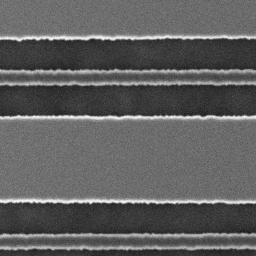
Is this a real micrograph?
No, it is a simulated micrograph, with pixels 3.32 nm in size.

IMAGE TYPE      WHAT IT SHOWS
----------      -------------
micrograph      lines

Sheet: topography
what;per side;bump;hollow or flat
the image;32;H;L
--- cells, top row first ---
HHHHHHHHHHHHHHHHHHHHHHHHHHHHHHHH
HHHHHHHHHHHHHHHHHHHHHHHHHHHHHHHH
HHHHHHHHHHHHHHHHHHHHHHHHHHHHHHHH
HHHHHHHHHHHHHHHHHHHHHHHHHHHHHHHH
HHHHHHHHHHHHHHHHHHHHHHHHHHHHHHHH
LLLLLLLLLLLLLLLLLLLLLLLLLLLLLLLL
LLLLLLLLLLLLLLLLLLLLLLLLLLLLLLLL
LLLLLLLLLLLLLLLLLLLLLLLLLLLLLLLL
LLLLLLLLLLLLLLLLLLLLLLLLLLLLLLLL
HHHHHHHHHHHHHHHHHHHHHHHHHHHHHHHH
HHHHHHHHHHHHHLLHHLLHLLHLHLLHHHLH
LLLLLLLLLLLLLLLLLLLLLLLLLLLLLLLL
LLLLLLLLLLLLLLLLLLLLLLLLLLLLLLLL
LLLLLLLLLLLLLLLLLLLLLLLLLLLLLLLL
LLLLLLLLLLLLLLLLLLLLLLLLLLLLLLLL
HHHHHHHHHHHHHHHHHHHHHHHHHHHHHHHH
HHHHHHHHHHHHHHHHHHHHHHHHHHHHHHHH
HHHHHHHHHHHHHHHHHHHHHHHHHHHHHHHH
HHHHHHHHHHHHHHHHHHHHHHHHHHHHHHHH
HHHHHHHHHHHHHHHHHHHHHHHHHHHHHHHH
HHHHHHHHHHHHHHHHHHHHHHHHHHHHHHHH
HHHHHHHHHHHHHHHHHHHHHHHHHHHHHHHH
HHHHHHHHHHHHHHHHHHHHHHHHHHHHHHHH
HHHHHHHHHHHHHHHHHHHHHHHHHHHHHHHH
HHHHHHHHHHHHHHHHHHHHHHHHHHHHHHHH
LLLLLLLLLLLLLLLLLLLLLLLLLLLLLLLL
LLLLLLLLLLLLLLLLLLLLLLLLLLLLLLLL
LLLLLLLLLLLLLLLLLLLLLLLLLLLLLLLL
LLLLLLLLLLLLLLLLLLLLLLLLLLLLLLLL
HHHHHHHHHHHHHHHHHHHHHHHHHHHHHHHH
HHHHHHHHHHHHHHHHHHHHHHHHHHHHHHHH
LLLLLLLLLLLLLLLLLLLLLLLLLLLLLLLL